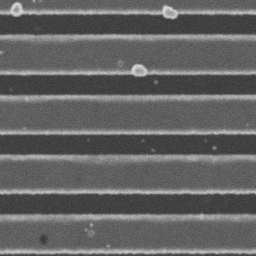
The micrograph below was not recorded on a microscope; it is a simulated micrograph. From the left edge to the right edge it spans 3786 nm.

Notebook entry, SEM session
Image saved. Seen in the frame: lines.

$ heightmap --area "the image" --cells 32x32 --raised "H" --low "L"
HHHHHHHHHHHHHHHHHHHHHHHHHHHHHHHH
HHHHHHHHHHHHHHHHHHHHHHHHHHHHHHHH
LLLLLLLLLLLLLLLLLLLLLLLLLLLLLLLL
LLLLLLLLLLLLLLLLLLLLLLLLLLLLLLLL
LLLLLLLLLLLLLLHLLLLLLLLLLLLLLLLL
HHHHHHHHHHHHHHHHHHHHHHHHHHHHHHHH
HHHHHHHHHHHHHHHHHHHHHHHHHHHHHHHH
HHHHHHHHHHHHHHHHHHHHHHHHHHHHHHHH
HHHHHHHHHHHHHHHHHHHHHHHHHHHHHHHH
LLLLLLLLLLLLLLLLLLLLLLLLLLLLLLLL
LLLLLLLLLLLLLLLLLLLLLLLLLLLLLLLL
LLLLLLLLLLLLLLLLLLLLLLLLLLLLLLLL
HHHHHHHHHHHHHHHHHHHHHHHHHHHHHHHH
HHHHHHHHHHHHHHHHHHHHHHHHHHHHHHHH
HHHHHHHHHHHHHHHHHHHHHHHHHHHHHHHH
HHHHHHHHHHHHHHHHHHHHHHHHHHHHHHHH
HHHHHHHHHHHHHHHHHHHHHHHHHHHHHHHH
LLLLLLLLLLLLLLLLLLLLLLLLLLLLLLLL
LLLLLLLLLLLLLLLLLLLLLLLLLLLLLLLL
HLLLHHLLLLLLLLLLLLLLLLLLLLLLLLLL
HHHHHHHHHHHHHHHHHHHHHHHHHHHHHHHH
HHHHHHHHHHHHHHHHHHHHHHHHHHHHHHHH
HHHHHHHHHHHHHHHHHHHHHHHHHHHHHHHH
HHHHHHHHHHHHHHHHHHHHHHHHHHHHHHHH
LLLLLLLLLLLLLLLLLLLLLLLLLLLLLLLL
LLLLLLLLLLLLLLLLLLLLLLLLLLLLLLLL
LLLLLLLLLLLLLLLLLLLLLLLLLLLLLLLL
HHHHHHHHHHHHHHHHHHHHHHHHHHHHHHHH
HHHHHHHHHHHHHHHHHHHHHHHHHHHHHHHH
HHHHHHHHHHHHHHHHHHHHHHHHHHHHHHHH
HHHHHHHHHHHHHHHHHHHHHHHHHHHHHHHH
HHHHHHHHHHHHHHHHHHHHHHHHHHHHHHHH